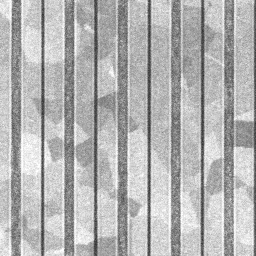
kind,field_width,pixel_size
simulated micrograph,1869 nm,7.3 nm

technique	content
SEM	parallel lines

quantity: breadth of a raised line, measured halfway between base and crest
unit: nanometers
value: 138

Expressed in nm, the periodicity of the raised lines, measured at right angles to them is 194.